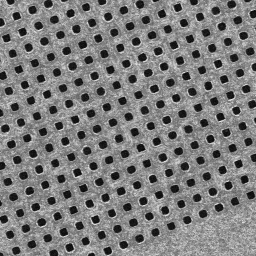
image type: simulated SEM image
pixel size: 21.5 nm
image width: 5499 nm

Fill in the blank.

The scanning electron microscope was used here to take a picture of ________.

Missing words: a regular array of holes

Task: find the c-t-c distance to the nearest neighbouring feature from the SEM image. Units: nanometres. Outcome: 354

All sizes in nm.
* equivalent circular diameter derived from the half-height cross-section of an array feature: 185